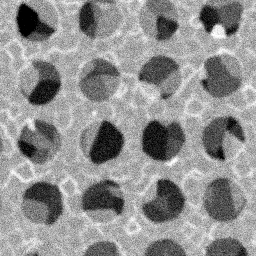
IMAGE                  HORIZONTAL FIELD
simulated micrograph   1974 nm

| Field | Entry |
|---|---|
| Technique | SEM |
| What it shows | a regular array of raised bodies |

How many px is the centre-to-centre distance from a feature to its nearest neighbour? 60.7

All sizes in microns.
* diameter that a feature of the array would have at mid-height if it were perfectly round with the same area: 0.345